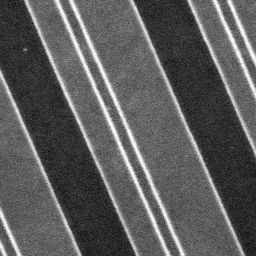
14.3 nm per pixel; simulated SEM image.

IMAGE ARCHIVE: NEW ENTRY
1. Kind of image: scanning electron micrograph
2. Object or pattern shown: lines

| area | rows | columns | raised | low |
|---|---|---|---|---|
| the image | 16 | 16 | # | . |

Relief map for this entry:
..######....####
..#######...####
...######....###
...#######...###
...#######....##
....#######...##
#...#######....#
#....#######...#
##...#######...#
##....######....
###...#######...
###....######...
####...#######..
####...#######..
####....#######.
#####...#######.